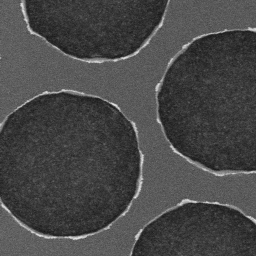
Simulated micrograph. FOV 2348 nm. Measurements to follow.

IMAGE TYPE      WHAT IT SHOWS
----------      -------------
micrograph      holes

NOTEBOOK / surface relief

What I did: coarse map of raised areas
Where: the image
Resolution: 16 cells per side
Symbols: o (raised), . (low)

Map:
oo........oooooo
oo........oooooo
ooo......ooo....
oooo....ooo.....
oooooooooo......
oooooooooo......
oo.....ooo......
........oo......
.........o......
.........oo.....
.........oooo...
.........ooooooo
........oooooooo
o......ooo.....o
oo....ooo.......
oooooooo........